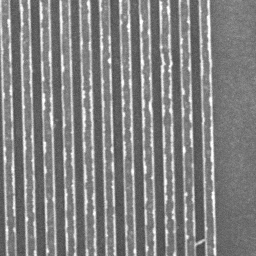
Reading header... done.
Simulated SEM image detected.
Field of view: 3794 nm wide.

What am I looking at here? parallel lines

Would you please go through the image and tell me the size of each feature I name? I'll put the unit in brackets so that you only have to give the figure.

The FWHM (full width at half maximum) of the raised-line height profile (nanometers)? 135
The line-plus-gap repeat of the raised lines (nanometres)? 296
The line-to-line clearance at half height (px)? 10.1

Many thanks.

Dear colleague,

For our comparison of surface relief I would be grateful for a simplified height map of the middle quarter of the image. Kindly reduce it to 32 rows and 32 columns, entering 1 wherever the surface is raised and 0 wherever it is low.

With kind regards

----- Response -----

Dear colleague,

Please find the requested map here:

11001110011100111001110011100111
11001110011100011001110011100111
11001110001100011000110011100111
11000110001100011000110011100111
11000110001100011000110011100111
11000110001100011001110011100111
11000110001100011001110011100011
11000110001100011000110001100011
11000110001100011000110001100011
11000110001100011000110001100011
11000110001100011000110001100011
11000110001100011000110001100011
11000110001100011000110001100011
11000110001100011000110001100011
11000110001100011000110001100011
11000110001100011000110001100011
11000110001100011000110001100011
11000110001100011000110001100011
11000110001100011000110001100011
11000110001100011000110001100011
11000110001100011000110001100011
11000110001100011000110001100011
11000110001100011000110001100011
11000110001100011000110001100011
11000110001100011000110001100011
11000110001100011000110001100011
11000110001100011000110001100011
11000110001100011000110001100011
11000110001100011000110001100011
11000110001100011000110001100011
11000111001100011000110001100011
11100111001100011000110001100011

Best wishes